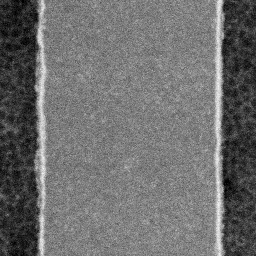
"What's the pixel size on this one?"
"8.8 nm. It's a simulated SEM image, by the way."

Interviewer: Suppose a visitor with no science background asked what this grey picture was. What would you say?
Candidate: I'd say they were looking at one or a few lines or trenches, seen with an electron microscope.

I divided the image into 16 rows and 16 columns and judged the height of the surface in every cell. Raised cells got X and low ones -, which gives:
---XXXXXXXXXXX--
---XXXXXXXXXXX--
---XXXXXXXXXXX--
---XXXXXXXXXXX--
---XXXXXXXXXXX--
---XXXXXXXXXXX--
---XXXXXXXXXXX--
---XXXXXXXXXXX--
---XXXXXXXXXXX--
---XXXXXXXXXXX--
---XXXXXXXXXXX--
---XXXXXXXXXXX--
---XXXXXXXXXXX--
---XXXXXXXXXXX--
---XXXXXXXXXXX--
---XXXXXXXXXXX--